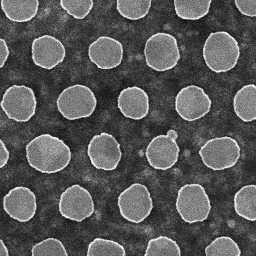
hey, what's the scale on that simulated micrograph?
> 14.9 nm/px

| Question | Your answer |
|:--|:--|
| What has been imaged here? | a regular array of raised bodies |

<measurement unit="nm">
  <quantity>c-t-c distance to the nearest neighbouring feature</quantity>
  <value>844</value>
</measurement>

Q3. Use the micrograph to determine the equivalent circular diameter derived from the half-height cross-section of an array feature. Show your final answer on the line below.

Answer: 509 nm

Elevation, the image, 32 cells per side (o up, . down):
ooooo...oooo...oooo...oooo...ooo
.oooo...ooo....ooo....oooo....oo
..o.............................
................................
...................oo.....ooo...
o...oooo....ooo...oooo....oooo..
o...oooo...oooo...oooo...ooooo..
o...oooo...oooo...oooo....oooo..
.............o.....oo.....ooo...
................................
................................
.ooo....ooo....ooo.....oo.....oo
oooo...ooooo...ooo....oooo...ooo
oooo...ooooo...ooo....oooo...ooo
.ooo....ooo.....oo.....oo.....oo
................................
.....................o..........
....ooo.....oo.....ooo....ooo...
o..oooooo..oooo...oooo...ooooo..
o..oooooo..oooo...oooo...ooooo..
o...oooo....ooo....ooo....ooo...
......o.........................
................................
..o......o......oo.....oo.....oo
.ooo....ooo....oooo...oooo...ooo
.ooo....oooo...oooo...oooo...ooo
.ooo....ooo....oooo...oooo....oo
..o......o......oo.....oo.......
................................
................................
.....ooo...oooo....ooo....ooo...
o...oooo...ooooo..oooo....oooo..